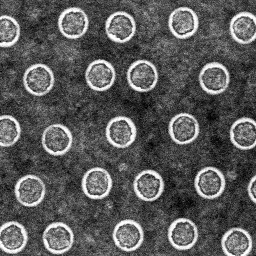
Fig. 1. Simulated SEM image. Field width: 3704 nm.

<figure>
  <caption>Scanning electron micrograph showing a regular array of raised bodies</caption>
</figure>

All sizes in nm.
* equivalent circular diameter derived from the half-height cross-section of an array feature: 418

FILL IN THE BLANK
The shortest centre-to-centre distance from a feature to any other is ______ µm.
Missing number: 0.798